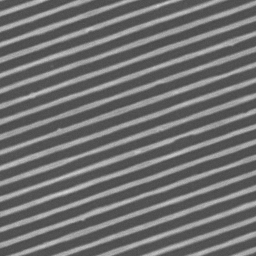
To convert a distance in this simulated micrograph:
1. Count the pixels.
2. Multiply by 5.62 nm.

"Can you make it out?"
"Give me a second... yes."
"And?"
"parallel lines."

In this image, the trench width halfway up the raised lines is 55.2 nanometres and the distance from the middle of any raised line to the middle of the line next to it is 14.6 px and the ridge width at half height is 0.0219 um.